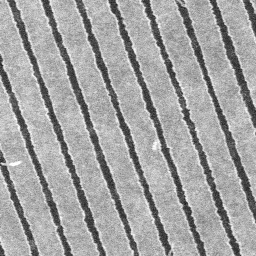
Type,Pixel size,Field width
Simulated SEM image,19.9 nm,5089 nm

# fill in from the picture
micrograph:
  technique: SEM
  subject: parallel lines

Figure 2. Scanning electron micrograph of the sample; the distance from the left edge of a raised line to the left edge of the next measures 628 nm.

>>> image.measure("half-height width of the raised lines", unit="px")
23.3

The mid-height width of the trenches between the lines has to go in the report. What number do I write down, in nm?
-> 159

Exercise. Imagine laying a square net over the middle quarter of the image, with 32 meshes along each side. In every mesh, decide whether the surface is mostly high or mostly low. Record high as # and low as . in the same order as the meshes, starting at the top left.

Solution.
..######...######..######..#####
#..######..######..######...####
...######..#######..######..####
#..######..#######..######..####
#...######..######..#######..###
##..######..#######..######..###
##..#######..######..#######..##
##...######..######...######..##
###..######..#######..######..##
###...######..######..######...#
####..######..######...######..#
####..######..#######..######..#
####...######..######..######...
#####..######..######...######..
#####..######...######..######..
#####...######..######...######.
#####...######...######..######.
######..#######..######..######.
######...######..######..#######
.######..######...######..######
.######..#######..######..######
.######...######..######...#####
.#######..######..#######..#####
..######..######...######..#####
..######...######..######...####
...######..######...######..####
#..######...######..######..####
#..######...######..#######..###
##..######..######..#######..###
##..######...######..######..###
##..#######..######..#######..##
###..######..#######..######..##